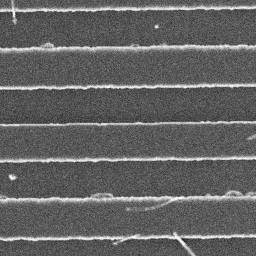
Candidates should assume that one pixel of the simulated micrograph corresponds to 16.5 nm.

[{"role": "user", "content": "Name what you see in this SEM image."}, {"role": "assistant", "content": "lines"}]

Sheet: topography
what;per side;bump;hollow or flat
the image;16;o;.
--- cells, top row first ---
oooooooooooooooo
................
................
oooooooooooooooo
oooooooooooooooo
oooo............
................
................
oooooooooooooooo
oooooooooooooooo
................
................
oooooooooooooooo
oooooooooooooooo
oooooooooooooooo
................